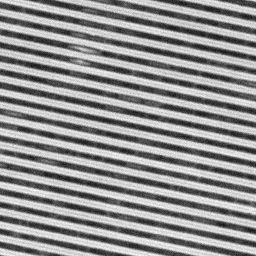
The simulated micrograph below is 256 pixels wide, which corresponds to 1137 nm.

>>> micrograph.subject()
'parallel lines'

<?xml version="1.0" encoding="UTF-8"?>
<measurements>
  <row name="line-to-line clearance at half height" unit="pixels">8.45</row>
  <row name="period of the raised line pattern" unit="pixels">13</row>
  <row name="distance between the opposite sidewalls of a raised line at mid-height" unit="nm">22.3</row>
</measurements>